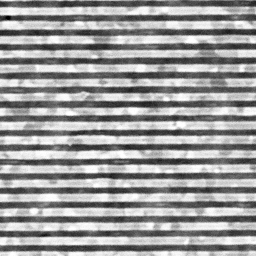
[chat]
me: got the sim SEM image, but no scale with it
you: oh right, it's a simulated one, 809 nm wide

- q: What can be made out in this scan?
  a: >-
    parallel lines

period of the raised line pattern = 14.4 px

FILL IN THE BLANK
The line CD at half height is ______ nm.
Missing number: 20.1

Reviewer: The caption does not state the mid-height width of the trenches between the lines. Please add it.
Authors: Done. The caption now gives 25.6 nm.